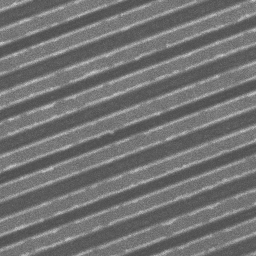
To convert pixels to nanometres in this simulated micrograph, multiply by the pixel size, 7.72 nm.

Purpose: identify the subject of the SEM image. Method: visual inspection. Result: parallel lines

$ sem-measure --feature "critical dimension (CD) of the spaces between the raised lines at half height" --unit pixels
10.4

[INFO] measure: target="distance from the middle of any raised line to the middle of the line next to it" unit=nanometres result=229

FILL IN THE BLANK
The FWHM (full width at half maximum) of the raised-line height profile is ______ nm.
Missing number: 139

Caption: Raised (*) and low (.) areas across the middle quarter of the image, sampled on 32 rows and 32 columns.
.*************.......***********
***********.......*************.
*********.......*************...
******.......*************......
***.......*************.........
*.......************...........*
.....*************..........****
..*************..........*******
************..........**********
**********..........************
*******..........*************..
****..........*************.....
**.........*************.......*
.........************.......****
.......************.......******
....************........********
.************........***********
***********.......*************.
********........************....
*****.......*************.......
***......*************..........
.......*************..........**
.....************..........*****
.*************...........*******
************..........**********
*********..........*************
******...........*************..
***...........*************.....
*..........*************.......*
........*************.......****
......*************.......******
...*************.......*********